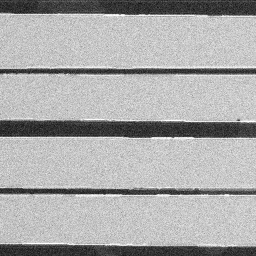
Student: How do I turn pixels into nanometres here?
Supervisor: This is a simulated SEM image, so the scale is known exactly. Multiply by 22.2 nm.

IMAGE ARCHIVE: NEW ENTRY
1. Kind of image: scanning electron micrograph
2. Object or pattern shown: lines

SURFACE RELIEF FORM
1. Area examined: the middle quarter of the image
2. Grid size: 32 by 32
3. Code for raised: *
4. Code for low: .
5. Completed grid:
................................
********************************
********************************
................................
................................
................................
................................
................................
................................
................................
................................
................................
................................
................................
********************************
********************************
********************************
********************************
................................
................................
................................
................................
................................
................................
................................
................................
................................
................................
................................
................................
................................
********************************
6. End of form